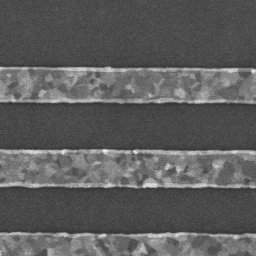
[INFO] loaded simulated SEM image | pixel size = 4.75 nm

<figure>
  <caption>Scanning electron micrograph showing one or a few lines or trenches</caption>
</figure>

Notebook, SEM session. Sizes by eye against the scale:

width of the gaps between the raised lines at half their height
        232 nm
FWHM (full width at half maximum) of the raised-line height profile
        0.164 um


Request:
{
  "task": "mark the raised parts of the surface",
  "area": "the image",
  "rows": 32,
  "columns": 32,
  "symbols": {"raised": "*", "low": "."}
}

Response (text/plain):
................................
................................
................................
................................
................................
................................
................................
................................
.............*..................
********************************
********************************
********************************
********************************
................................
................................
................................
................................
................................
................................
********************************
********************************
********************************
********************************
................................
................................
................................
................................
................................
................................
********************************
********************************
********************************